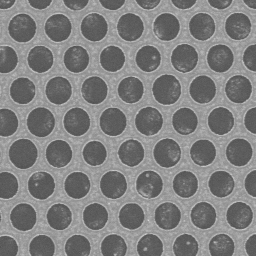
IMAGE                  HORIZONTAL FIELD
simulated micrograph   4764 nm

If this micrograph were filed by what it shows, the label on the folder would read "a regular array of holes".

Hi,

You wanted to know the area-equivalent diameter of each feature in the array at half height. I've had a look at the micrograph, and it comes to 514 nm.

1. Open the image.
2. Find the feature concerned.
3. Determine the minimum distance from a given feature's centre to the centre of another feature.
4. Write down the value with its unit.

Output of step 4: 0.665 micrometres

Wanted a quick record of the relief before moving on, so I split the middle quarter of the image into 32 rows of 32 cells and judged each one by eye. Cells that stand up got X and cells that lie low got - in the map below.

------XXX------XXX------XXX--X--
X----XXXXX----XXXXX----XXXXX----
XXXXXXXXXXXXXXXXXXXXXXXXX-XXXXXX
XXXXXX---XXXXXX----XXXX-----XXXX
--XXX-----XXXX-----XXX-------XXX
--XX-------XXX------XX-------XX-
--XX-------XX-------XX--------X-
--XX-------XXX------XX-------XX-
--XXX-----XXXX-----XXXX------XXX
-XXXXX---XXXXXX---XXXXX-----XXXX
XXXXXXXXXXXXXXXXXXXXXXXXXXXXXXXX
X----XXXXX----XXXXX----XXXXX----
------XXX------XXX------XXX-----
------XXX------XXX-------XX-----
-------XX-------XX-------XX-----
------XXX-------XX-------XX-----
------XXX------XXX------XXXX----
X----XXXXX----XXXXX----XXXXXX--X
XXXXXXXXXXXXXXXXXXXXXXXXX--XXXXX
-XXXXX---XXXXXX----XXXX-----XXXX
--XXX-----XXXX--X---XXX------XXX
--XXX------XXX------XX-------XXX
--XXX------XX-------XX-----X-XX-
--XXX------XXX------XXX----X-XXX
--XXX-----XXXX-----XXXX------XXX
XXXXXXX--XXXXXXX--XXXXXX----XXXX
XXXXXXXXXXXX-XXXXXXXX-XXXXXXXXXX
X----XXXXX-----XXXX----XXXXXX---
------XXX------XXX------XXX-----
------XXX-------XX-------XX--X--
-------XX-------XX-------XX---X-
-------XX-------XX------XXX-----